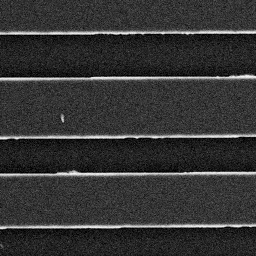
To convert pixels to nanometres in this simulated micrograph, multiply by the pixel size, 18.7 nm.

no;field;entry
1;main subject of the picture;lines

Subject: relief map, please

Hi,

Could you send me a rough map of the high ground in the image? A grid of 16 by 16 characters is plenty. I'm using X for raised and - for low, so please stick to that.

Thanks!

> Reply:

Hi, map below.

XXXXXXXXXXXXXXXX
XXXXXXXXXXXXXXXX
----------------
----------------
----------------
XXXXXXXXXXXXXXXX
XXXXXXXXXXXXXXXX
XXXXXXXXXXXXXXXX
XXXXXXXXXXXXXXXX
----------------
----------------
XXXXXXXXXXXXXXXX
XXXXXXXXXXXXXXXX
XXXXXXXXXXXXXXXX
----------------
----------------